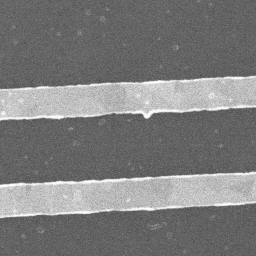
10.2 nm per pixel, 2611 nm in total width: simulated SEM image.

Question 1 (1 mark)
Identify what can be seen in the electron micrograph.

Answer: one or a few lines or trenches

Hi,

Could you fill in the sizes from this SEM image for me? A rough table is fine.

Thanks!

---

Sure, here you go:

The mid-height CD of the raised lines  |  0.308 µm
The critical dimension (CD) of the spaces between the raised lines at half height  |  672 nm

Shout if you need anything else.